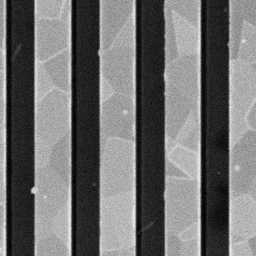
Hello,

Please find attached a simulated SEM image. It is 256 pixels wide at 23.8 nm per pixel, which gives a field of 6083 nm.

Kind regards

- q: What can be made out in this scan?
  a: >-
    lines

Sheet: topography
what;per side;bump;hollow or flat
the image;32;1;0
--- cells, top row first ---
10001111100001111000011110000111
10001111100001111000011110000111
10001111100001111000011110000111
10001111100001111000011110000111
10001111100001111000011110000111
10001111100001111000011110000111
10001111100011111000011110000111
10001111100001111000011110000111
10001111100001111000011110000111
10001111100001111000011110000111
10001111100001111000011110000111
10001111100001111000011110000111
10001111100001111000011110000111
10001111100001111000011110000111
10001111100001111000011110000111
10001111100001111000011110000111
10001111100001111000011110000111
10001111100001111000011110000111
10001111100001111000011110000111
10001111100001111000011110000111
10001111100001111000011110000111
10001111100001111000011110000111
10001111100001111000011110000111
10001111100001111000011110000111
10001111100001111000011110000111
10001111100001111000011110000111
10001111100001111000011110000111
10001111100001111000011110000111
10001111100001111000011110000111
10001111100001111000011110000111
10001111100001111000011110000111
10001111100001111000011110000111